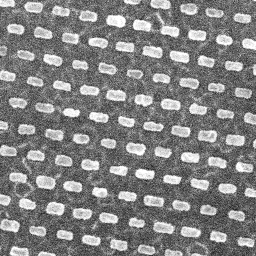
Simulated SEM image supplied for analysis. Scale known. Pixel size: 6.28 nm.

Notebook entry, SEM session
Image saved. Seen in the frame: a regular array of raised bodies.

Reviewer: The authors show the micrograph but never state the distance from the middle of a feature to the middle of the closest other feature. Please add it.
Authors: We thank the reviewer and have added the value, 171 nm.